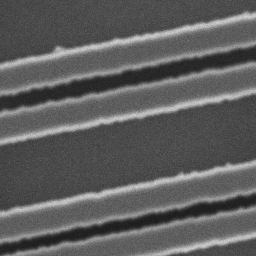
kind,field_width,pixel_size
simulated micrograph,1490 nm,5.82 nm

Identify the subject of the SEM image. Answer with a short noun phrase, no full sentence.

lines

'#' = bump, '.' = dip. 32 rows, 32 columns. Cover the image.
................................
................................
............................####
.......................#########
..................##############
.............###################
........###################.....
...###################..........
#################...........####
############...........#########
#######...........##############
##...........###################
........###################.....
..####################..........
##################..............
############....................
#######.........................
##..............................
................................
................................
...............................#
..........................######
....................############
................################
..........####################..
......##################........
.###################........####
###############........#########
#########.........##############
#####........###################
.......####################.....
..####################..........